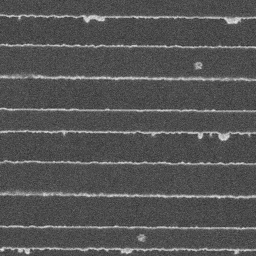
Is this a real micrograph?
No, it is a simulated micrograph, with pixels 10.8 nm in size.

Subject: lines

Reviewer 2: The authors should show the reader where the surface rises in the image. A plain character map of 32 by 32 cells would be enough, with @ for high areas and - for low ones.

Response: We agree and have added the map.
@@@@@@@@@@@@@@@@@@@@@@@@@@@@@@@@
@@@@@@@@@@@@@@@@@@@@@@@@@@@@@@@@
----------------------------@@--
--------------------------------
--------------------------------
--------------------------------
@@@@@@@@@@@@@@@@@@@@@@@@@@@@@@@@
@@@@@@@@@@@@@@@@@@@@@@@@@@@@@@@@
@@@@@@@@@@@@@@@@@@@@@@@@@@@@@@@@
@@@@@@@@@@@@@@@@@@@@@@@@@@@@@@@@
--------------------------------
--------------------------------
--------------------------------
--------------------------------
@@@@@@@@@@@@@@@@@@@@@@@@@@@@@@@@
@@@@@@@@@@@@@@@@@@@@@@@@@@@@@@@@
@---@@@@@@@@@@@@@@@@@@@@@@@@@@@@
--------------------------------
--------------------------------
--------------------------------
@@@@@@@@@@@@@@@@@@@@@@@@-@@@@@@-
@@@@@@@@@@@@@@@@@@@@@@@@@@@@@@@@
@@@@@@@@@@@@@@@@@@@@@@@@@@@@@@@@
@@@@@@@@@@@@@@@@@@@@@@@@@@@@@@@@
-------------@--@-@@@@@@@@@@@@@@
--------------------------------
--------------------------------
--------------------------------
@@@@@@@@@@@@@@@@@@@@@@@@@-------
@@@@@@@@@@@@@@@@@@@@@@@@@@@@@@@@
@@@@@@@@@@@@@@@@@@@@@@@@@@@@@@@@
--------------------------------